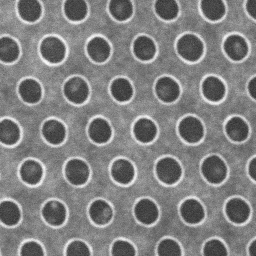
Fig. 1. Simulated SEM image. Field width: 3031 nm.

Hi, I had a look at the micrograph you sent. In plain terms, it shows a regular array of holes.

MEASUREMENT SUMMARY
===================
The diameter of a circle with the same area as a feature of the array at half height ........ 0.313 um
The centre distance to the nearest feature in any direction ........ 0.541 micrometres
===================